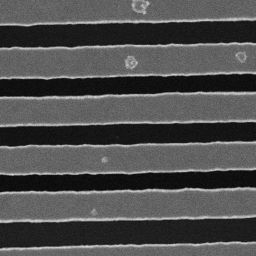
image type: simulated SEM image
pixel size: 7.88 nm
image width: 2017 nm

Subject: lines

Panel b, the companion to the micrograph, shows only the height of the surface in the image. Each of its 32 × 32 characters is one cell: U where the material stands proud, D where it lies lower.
UUUUUUUUUUUUUUUUUUUUUUUUUUUUUUUU
UUUUUUUUUUUUUUUUUUUUUUUUUUUUUUUU
UUUUUUUUUUUUUUUUUUUUUUUUUUUUUUDU
DDDDDDDDDDDDDDDDDDDDDDDDDDDDDDDD
DDDDDDDDDDDDDDDDDDDDDDDDDDDDDDDD
DDDDDDDDDDDDDDDDDDDDDUDDUUUUUUUU
UUUUUUUUUUUUUUUUUUUUUUUUUUUUUUUU
UUUUUUUUUUUUUUUUUUUUUUUUUUUUUUUU
UUUUUUUUUUUUUUUUUUUUUUUUUUUUUUUU
UUUUUUUUUUUUUUUDDDDDUDDDDDDDDDDD
DDDDDDDDDDDDDDDDDDDDDDDDDDDDDDDD
DDDDDDDDDDDDDDDDDDDDDDDDDDDDDDDD
UUUUUUUUUUUUUUUUUUUUUUUUUUUUUUUU
UUUUUUUUUUUUUUUUUUUUUUUUUUUUUUUU
UUUUUUUUUUUUUUUUUUUUUUUUUUUUUUUU
UUUUUUUUUUUUUUUDDDDDDDDDDDDDDDDD
DDDDDDDDDDDDDDDDDDDDDDDDDDDDDDDD
DDDDDDDDDDDDDDDDDDDDDDDDDDDDDDDD
UUUUUUUUUUUUUUUUUUUUUUUUUUUUUUUU
UUUUUUUUUUUUUUUUUUUUUUUUUUUUUUUU
UUUUUUUUUUUUUUUUUUUUUUUUUUUUUUUU
UUUUUUUUUUUUUUUUUUUUUUDDDDDDDDDD
DDDDDDDDDDDDDDDDDDDDDDDDDDDDDDDD
DDDDDDDDDDDDDDDDDDDDDDDUDDDDUUUU
UUUUUUUUUUUUUUUUUUUUUUUUUUUUUUUU
UUUUUUUUUUUUUUUUUUUUUUUUUUUUUUUU
UUUUUUUUUUUUUUUUUUUUUUUUUUUUUUUU
UUUUUUUUUUUUUUDDDDDDDDDDDDDDDDDD
DDDDDDDDDDDDDDDDDDDDDDDDDDDDDDDD
DDDDDDDDDDDDDDDDDDDDDDDDDDDDDDDD
DDDDDDDDDDDDDDDDDDDDDDUUDUUUUUUU
UUUUUUUUUUUUUUUUUUUUUUUUUUUUUUUU